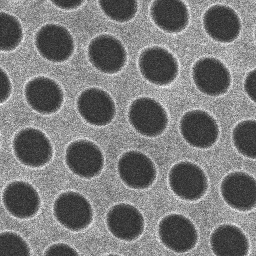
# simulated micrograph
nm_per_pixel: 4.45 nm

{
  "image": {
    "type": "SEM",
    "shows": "a regular array of holes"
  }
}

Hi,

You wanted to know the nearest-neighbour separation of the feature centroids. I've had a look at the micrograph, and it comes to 236 nanometres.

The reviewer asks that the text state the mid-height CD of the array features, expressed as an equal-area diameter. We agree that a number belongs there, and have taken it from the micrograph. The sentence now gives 162 nm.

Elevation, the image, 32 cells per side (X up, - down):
XXXXXXX---XXX----XX----XXXXXXXXX
XXXXXXXXXXXXX----XX----XXX---XXX
--XXXXXXXXXXXXX-XXX----XXX----XX
---XX---XXXXXXXXXXXX---XXX----XX
---XX----XXXXXXXXXXXXXXXXX----XX
--XXX----XX----XXXXXXXXXXXXXXXXX
XXXXX----XX-----XX---XXXXXXXXXXX
XXXXXX--XXX-----X-----XXX--XXXXX
XXXXXXXXXXXX---XXX----XX----XXXX
-XXXXXXXXXXXXXXXXX----XX-----XX-
-XXX---XXXXXXXXXXXXX-XXXX----XX-
-XX-----XX---XXXXXXXXXXXX---XXX-
-XXX----XX----XXX--XXXXXXXXXXXXX
XXXX---XXX----XX----XXXXXXXXXXXX
XXXXXXXXXX----XX-----XX---XXXXXX
XXXXXXXXXXXX-XXXX----XX----XXX--
XXX--XXXXXXXXXXXX---XXX----XX---
XX----XXXXXXXXXXXXXXXXX----XX---
XX----XXX---XXXXXXXXXXXXXXXXXX--
XX----XX-----XX---XXXXXXXXXXXXX-
XXX--XXX-----XX----XXX--XXXXXXXX
XXXXXXXXX---XXX----XX----XXXXXXX
XXXXXXXXXXXXXXX----XX-----XX----
X---XXXXXXXXXXXXXXXXXX----XX----
-----XXX--XXXXXXXXXXXX---XXX----
X----XX----XXXXXXXXXXXXXXXXXX---
X---XXX-----XX---XXXXXXXXXXXXXXX
XXXXXXX----XX-----XX---XXXXXXXXX
XXXXXXXXX-XXXX----XX----XXX---XX
--XXXXXXXXXXXX---XXX-----XX----X
---XXXXXXXXXXXXXXXXXX---XX-----X
----XX---XXXXXXXXXXXXXXXXXX----X